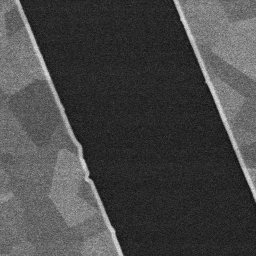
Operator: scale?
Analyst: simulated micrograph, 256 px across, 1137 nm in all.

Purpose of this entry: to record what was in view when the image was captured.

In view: one or a few lines or trenches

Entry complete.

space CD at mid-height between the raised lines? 649 nm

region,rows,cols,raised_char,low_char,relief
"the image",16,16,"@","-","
@----------@@@@@
@@----------@@@@
@@----------@@@@
@@----------@@@@
@@@----------@@@
@@@----------@@@
@@@@----------@@
@@@@----------@@
@@@@@---------@@
@@@@@----------@
@@@@@----------@
@@@@@@----------
@@@@@@----------
@@@@@@@---------
@@@@@@@---------
@@@@@@@---------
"